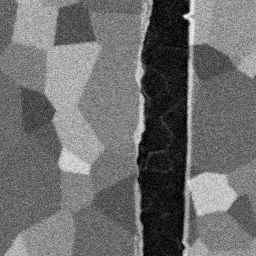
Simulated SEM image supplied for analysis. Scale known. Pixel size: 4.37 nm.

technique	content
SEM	one or a few lines or trenches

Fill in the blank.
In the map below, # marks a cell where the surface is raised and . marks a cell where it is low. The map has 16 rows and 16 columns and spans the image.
#########...####
#########...####
#########...####
#########...####
#########...####
#########...####
#########...####
#########...####
#########...####
#########...####
#########...####
#########...####
#########...####
#########...####
#########...####
#########...####